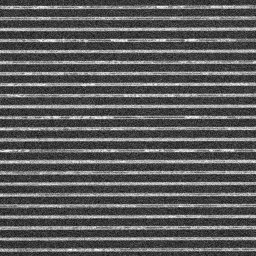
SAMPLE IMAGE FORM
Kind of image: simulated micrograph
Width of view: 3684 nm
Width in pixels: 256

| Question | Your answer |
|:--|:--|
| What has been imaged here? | parallel lines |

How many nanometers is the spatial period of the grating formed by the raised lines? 159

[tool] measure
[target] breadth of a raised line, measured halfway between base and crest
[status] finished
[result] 27 nm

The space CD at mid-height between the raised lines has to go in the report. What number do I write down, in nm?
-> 124